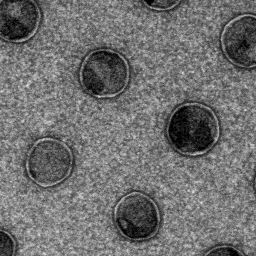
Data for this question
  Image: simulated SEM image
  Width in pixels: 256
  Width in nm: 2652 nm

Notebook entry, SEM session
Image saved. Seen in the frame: raised bodies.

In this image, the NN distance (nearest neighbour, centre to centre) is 1070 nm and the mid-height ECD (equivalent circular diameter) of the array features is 489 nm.